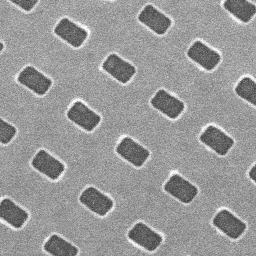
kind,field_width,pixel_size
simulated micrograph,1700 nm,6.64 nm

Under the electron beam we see a regular array of holes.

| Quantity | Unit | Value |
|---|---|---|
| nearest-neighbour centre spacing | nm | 397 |